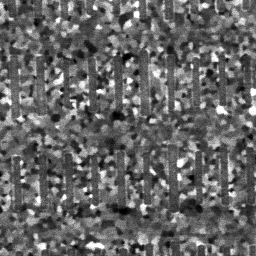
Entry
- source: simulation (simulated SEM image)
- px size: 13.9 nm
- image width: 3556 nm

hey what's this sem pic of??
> a regular array of holes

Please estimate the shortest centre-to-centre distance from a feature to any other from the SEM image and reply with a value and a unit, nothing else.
0.356 microns